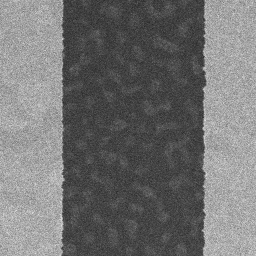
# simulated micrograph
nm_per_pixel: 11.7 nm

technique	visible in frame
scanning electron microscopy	one or a few lines or trenches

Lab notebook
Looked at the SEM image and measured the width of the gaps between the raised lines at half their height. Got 1640 nm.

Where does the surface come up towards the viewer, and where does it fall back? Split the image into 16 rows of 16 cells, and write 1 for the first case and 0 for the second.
1111000000000111
1111000000000111
1111000000000111
1111000000000111
1111000000000111
1111000000000111
1111000000000111
1111000000000111
1111000000000111
1111000000000111
1111000000000111
1111000000000111
1111000000000111
1111000000000111
1111000000000111
1111000000000111